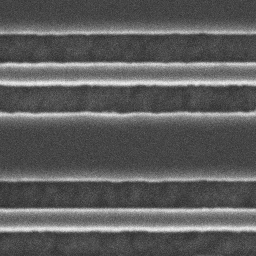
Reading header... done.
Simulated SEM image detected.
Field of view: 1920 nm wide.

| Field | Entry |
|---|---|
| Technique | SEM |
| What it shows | lines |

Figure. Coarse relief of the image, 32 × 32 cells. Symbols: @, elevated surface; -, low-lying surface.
@@@@@@@@@@@@@@@@@@@@@@@@@@@@@@@@
@@@@@@@@@@@@@@@@@@@@@@@@@@@@@@@@
@@@@@@@@@@@@@@@@@@@@@@@@@@@@@@@@
@@@@@@@@@@@@@@@@@@@@@@@@@@@@@@@@
--------------------------------
--------------------------------
--------------------------------
--------------------------------
@@@@@@@@@@@@@@@@@@@@@@@@@@@@@@@@
@@@@@@@@@@@@@@@@@@@@@@@@@@@@@@@@
@@@@@@@@@@@@@@@@@@@@@@@@@@@@@@@@
--------------------------------
--------------------------------
--------------------------------
@@@@@@@@@@@@@@@@@@@@@@@@@@@@@@@@
@@@@@@@@@@@@@@@@@@@@@@@@@@@@@@@@
@@@@@@@@@@@@@@@@@@@@@@@@@@@@@@@@
@@@@@@@@@@@@@@@@@@@@@@@@@@@@@@@@
@@@@@@@@@@@@@@@@@@@@@@@@@@@@@@@@
@@@@@@@@@@@@@@@@@@@@@@@@@@@@@@@@
@@@@@@@@@@@@@@@@@@@@@@@@@@@@@@@@
@@@@@@@@@@@@@@@@@@@@@@@@@@@@@@@@
@@@@@@@@@@@@@@@@@@@@@@@@@-@@@@@@
--------------------------------
--------------------------------
--------------------------------
@@@@@@@@@@@@@@@@@@@@@@@@@@@@@@@@
@@@@@@@@@@@@@@@@@@@@@@@@@@@@@@@@
@@@@@@@@@@@@@@@@@@@@@@@@@@@@@@@@
--------------------------------
--------------------------------
--------------------------------